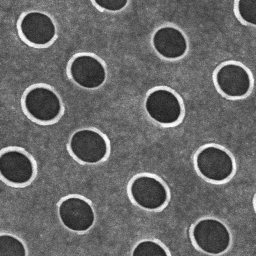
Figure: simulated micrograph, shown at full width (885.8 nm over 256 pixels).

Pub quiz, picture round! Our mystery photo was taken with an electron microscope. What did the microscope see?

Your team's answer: a regular array of holes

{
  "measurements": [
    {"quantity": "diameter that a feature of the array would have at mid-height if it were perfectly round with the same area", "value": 0.118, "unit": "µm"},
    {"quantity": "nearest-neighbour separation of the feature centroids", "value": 230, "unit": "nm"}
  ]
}